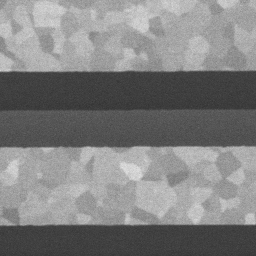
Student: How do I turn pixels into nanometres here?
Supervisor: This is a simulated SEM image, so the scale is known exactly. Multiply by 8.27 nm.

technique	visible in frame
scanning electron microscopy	lines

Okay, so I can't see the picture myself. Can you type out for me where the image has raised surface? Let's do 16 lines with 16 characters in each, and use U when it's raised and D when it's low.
UUUUUUUUUUUUUUUU
UUUUUUUUUUUUUUUU
UUUUUUUUUUUUUUUU
UUUUUUUUUUUUUUUU
DDDDDDDDDDDDDDDD
DDDDDDDDDDDDDDDD
DDDDDDDDDDDDDDDD
UUUUUUUUUUUUUUUU
UUUUUUUUUUUUUUUU
UUUUUUUUUUUUUUUU
UUUUUUUUUUUUUUUU
UUUUUUUUUUUUUUUU
UUUUUUUUUUUUUUUU
UUUUUUUUUUUUUUUU
DDDDDDDDDDDDDDDD
DDDDDDDDDDDDDDDD